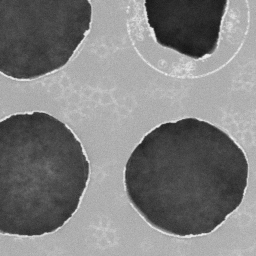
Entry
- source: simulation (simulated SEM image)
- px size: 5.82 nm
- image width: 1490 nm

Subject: holes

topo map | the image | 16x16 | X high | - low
------XXX-----XX
------XXX-----XX
-----XXXXX----XX
----XXXXXXXX-XXX
---XXXXXXXXXXXXX
XXXXXXXXXXXXXXXX
XXXXXXXXXXXXXXXX
----XXXXXXX-XXXX
-----XXXX-----XX
-----XXX-------X
------XX-------X
-----XXX-------X
-----XXX-------X
----XXXXX-----XX
---XXXXXXXX--XXX
XXXXXXXXXXXXXXXX